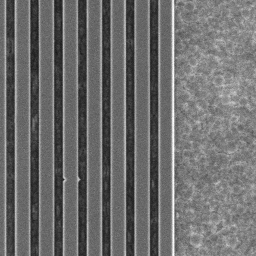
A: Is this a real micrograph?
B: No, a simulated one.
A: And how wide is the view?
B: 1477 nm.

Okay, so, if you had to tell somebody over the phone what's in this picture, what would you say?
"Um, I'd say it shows parallel lines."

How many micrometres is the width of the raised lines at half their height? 0.0859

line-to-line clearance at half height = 0.0534 µm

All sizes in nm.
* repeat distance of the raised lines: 138